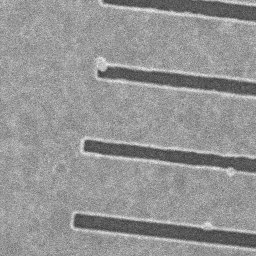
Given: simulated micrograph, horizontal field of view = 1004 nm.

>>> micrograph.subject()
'one or a few lines or trenches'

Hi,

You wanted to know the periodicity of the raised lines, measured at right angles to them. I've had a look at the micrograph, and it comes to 294 nm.